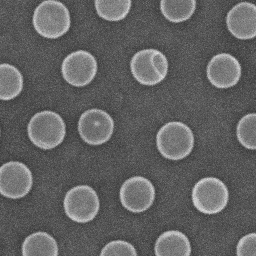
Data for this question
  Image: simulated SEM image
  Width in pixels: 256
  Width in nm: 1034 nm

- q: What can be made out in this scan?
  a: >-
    a regular array of raised bodies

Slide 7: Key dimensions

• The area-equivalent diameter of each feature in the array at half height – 142 nanometres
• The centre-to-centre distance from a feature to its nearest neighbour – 229 nanometres